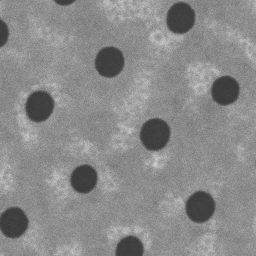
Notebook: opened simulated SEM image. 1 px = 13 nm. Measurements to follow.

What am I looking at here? holes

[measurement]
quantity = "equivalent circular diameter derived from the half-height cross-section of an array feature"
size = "403 nm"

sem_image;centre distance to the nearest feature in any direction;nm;1080